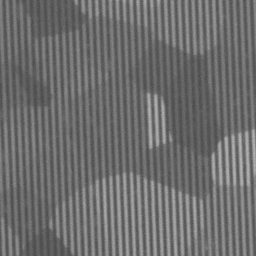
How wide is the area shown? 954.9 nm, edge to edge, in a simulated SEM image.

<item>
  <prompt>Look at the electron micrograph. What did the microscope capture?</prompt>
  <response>parallel lines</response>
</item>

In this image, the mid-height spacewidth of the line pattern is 4.24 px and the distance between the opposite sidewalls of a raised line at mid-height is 0.0079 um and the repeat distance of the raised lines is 25.6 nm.